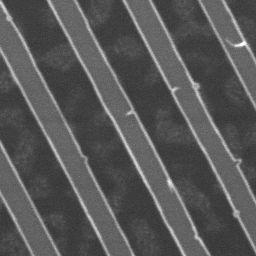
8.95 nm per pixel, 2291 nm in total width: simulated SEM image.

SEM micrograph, one or a few lines or trenches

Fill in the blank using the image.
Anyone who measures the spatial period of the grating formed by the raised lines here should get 592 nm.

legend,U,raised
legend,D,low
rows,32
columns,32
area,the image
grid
UUUUUUDDDDUUUUUUDDDUUUUUUDDDUUUU
DUUUUUUDDDUUUUUUDDDDUUUUUUDDDUUU
DUUUUUUDDDDUUUUUUDDDUUUUUUDDDUUU
DDUUUUUUDDDUUUUUUDDDDUUUUUUDDDUU
DDDUUUUUDDDDUUUUUUDDDUUUUUUDDDUU
DDDUUUUUUDDDUUUUUUDDDDUUUUUUDDDU
DDDDUUUUUDDDDUUUUUUDDDUUUUUUDDDU
UDDDUUUUUUDDDUUUUUUDDDDUUUUUUDDD
UDDDUUUUUUUDDDUUUUUUDDDUUUUUUDDD
UUDDDUUUUUUDDDUUUUUUDDDDUUUUUUDD
UUDDDDUUUUUUDDDUUUUUUDDDUUUUUUDD
UUUDDDUUUUUUDDDUUUUUUUDDDUUUUUUD
UUUDDDDUUUUUUDDDUUUUUUDDDUUUUUUD
UUUUDDDUUUUUUDDDUUUUUUUDDDUUUUUU
UUUUDDDDUUUUUUDDDUUUUUUDDDUUUUUU
UUUUUDDDUUUUUUDDDUUUUUUUDDDUUUUU
UUUUUUDDDUUUUUUDDDUUUUUUDDDUUUUU
UUUUUUDDDUUUUUUUDDDUUUUUUDDDUUUU
UUUUUUUDDDUUUUUUDDDUUUUUUDDDUUUU
DUUUUUUDDDUUUUUUDDDDUUUUUUDDDUUU
DUUUUUUUDDDUUUUUUDDDUUUUUUDDDDUU
DDUUUUUUDDDUUUUUUUDDDUUUUUUDDDUU
DDUUUUUUUDDDUUUUUUDDDUUUUUUDDDDU
DDDUUUUUUDDDUUUUUUUDDDUUUUUUDDDU
DDDDUUUUUUDDDUUUUUUDDDUUUUUUDDDD
UDDDUUUUUUDDDUUUUUUUDDDUUUUUUDDD
UDDDDUUUUUUDDDUUUUUUDDDUUUUUUUDD
UUDDDUUUUUUDDDUUUUUUUDDDUUUUUUDD
UUDDDDUUUUUUDDDUUUUUUDDDUUUUUUDD
UUUDDDUUUUUUDDDUUUUUUUDDDUUUUUUD
UUUDDDDUUUUUUDDDUUUUUUDDDUUUUUUU
UUUUDDDUUUUUUDDDUUUUUUUDDDUUUUUU